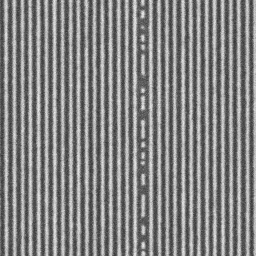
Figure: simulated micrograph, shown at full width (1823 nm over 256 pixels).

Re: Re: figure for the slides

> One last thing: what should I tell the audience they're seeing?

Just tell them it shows parallel lines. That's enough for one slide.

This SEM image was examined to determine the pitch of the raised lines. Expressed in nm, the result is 57.2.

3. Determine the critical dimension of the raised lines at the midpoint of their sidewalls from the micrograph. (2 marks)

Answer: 2.75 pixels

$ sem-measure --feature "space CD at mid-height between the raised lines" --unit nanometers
40